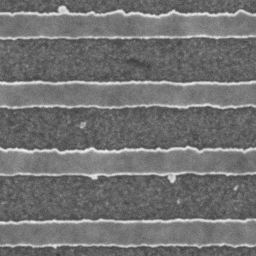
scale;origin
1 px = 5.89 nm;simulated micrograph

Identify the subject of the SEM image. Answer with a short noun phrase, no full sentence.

lines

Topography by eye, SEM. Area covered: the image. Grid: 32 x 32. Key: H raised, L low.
LLLLLLLLLLLLLLLLLLLLLLLLLLLLLLLL
LLLLLLLLLLLLLLHLLLLLLHLLLLLLLLHL
HHHHHHHHHHHHHHHHHHHHHHHHHHHHHHHH
HHHHHHHHHHHHHHHHHHHHHHHHHHHHHHHH
HHHHHHHHHHHHHHHHHHHHHHHHHHHHHHHH
LLLLLLLLLLLLLLLLLLLLLLLLLLLLLLLL
LLLLLLLLLLLLLLLLLLLLLLLLLLLLLLLL
LLLLLLLLLLLLLLLLLLLLLLLLLLLLLLLL
LLLLLLLLLLLLLLLLLLLLLLLLLLLLLLLL
LLLLLLLLLLLLLLLLLLLLLLLLLLLLLLLL
HHHHHHHHHHHHHHHHHHHHHHHHHHHHHHHH
HHHHHHHHHHHHHHHHHHHHHHHHHHHHHHHH
HHHHHHHHHHHHHHHHHHHHHHHHHHHHHHHH
LLLLLLLLLLLLLLLLLLLLLLLLLLLLLLLL
LLLLLLLLLLLLLLLLLLLLLLLLLLLLLLLL
LLLLLLLLLLLLLLLLLLLLLLLLLLLLLLLL
LLLLLLLLLLLLLLLLLLLLLLLLLLLLLLLL
LLLLLLLLLLLLLLLLLLLLLLLLLLLLLLLL
LLLLLLLLLLLLLLLLLLLLLLLHLLLLLLLL
HHHHHHHHHHHHHHHHHHHHHHHHHHHHHHHH
HHHHHHHHHHHHHHHHHHHHHHHHHHHHHHHH
HHHHHHHHHHHHHHHHHHHHHHHHHHHHHHHH
LLLLLLLLLLLLLLLLLLLLLLLLLLLLLLLL
LLLLLLLLLLLLLLLLLLLLLLLLLLLLLLLL
LLLLLLLLLLLLLLLLLLLLLLLLLLLLLLLL
LLLLLLLLLLLLLLLLLLLLLLLLLLLLLLLL
LLLLLLLLLLLLLLLLLLLLLLLLLLLLLLLL
LLLLLLLLLLLLLLLLLLLLLLHLHLLLHLLH
HHHHHHHHHHHHHHHHHHHHHHHHHHHHHHHH
HHHHHHHHHHHHHHHHHHHHHHHHHHHHHHHH
HHHHHHHHHHHHHHHHHHHHHHHHHHHHHHHH
LLLLLLLLLLLLLLLLLLLLLLLLLLLLLLLL